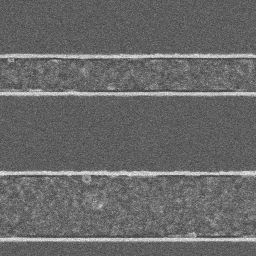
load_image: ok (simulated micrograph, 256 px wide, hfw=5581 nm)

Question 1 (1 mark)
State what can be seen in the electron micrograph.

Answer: one or a few lines or trenches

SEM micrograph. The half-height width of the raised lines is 1750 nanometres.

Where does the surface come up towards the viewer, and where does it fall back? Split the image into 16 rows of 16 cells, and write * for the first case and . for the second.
****************
****************
****************
******..........
................
................
****************
****************
****************
****************
****************
................
................
................
................
****************